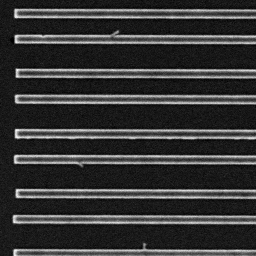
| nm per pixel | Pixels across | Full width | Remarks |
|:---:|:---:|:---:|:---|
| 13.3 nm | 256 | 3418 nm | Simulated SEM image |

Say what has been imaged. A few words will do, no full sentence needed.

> parallel lines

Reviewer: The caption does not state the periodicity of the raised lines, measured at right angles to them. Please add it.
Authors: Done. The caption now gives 392 nanometers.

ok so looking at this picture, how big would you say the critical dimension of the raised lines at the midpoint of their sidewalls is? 0.105 micrometres